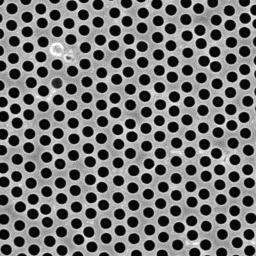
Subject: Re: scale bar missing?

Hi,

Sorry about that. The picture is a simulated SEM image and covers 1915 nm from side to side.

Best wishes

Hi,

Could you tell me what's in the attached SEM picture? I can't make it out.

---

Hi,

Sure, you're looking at a regular array of holes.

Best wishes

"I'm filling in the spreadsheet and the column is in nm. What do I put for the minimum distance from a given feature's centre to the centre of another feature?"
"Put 113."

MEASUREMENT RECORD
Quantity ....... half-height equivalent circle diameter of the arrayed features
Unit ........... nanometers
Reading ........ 84.5